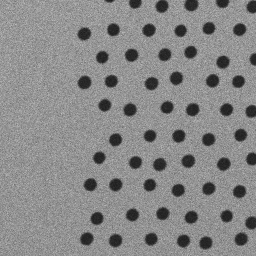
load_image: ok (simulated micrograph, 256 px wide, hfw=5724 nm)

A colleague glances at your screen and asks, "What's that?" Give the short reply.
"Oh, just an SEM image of a regular array of holes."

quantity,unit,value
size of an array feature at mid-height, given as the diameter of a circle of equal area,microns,0.29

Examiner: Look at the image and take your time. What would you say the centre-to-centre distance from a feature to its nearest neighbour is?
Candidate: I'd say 0.57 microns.